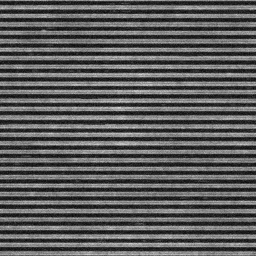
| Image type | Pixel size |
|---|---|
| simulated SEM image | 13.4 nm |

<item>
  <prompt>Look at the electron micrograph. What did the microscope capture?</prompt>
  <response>parallel lines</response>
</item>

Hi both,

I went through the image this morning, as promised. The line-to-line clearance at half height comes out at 67.1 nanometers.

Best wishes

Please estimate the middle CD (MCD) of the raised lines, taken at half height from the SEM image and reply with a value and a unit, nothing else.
40.2 nanometers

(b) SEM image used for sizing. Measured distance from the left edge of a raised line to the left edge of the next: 114 nanometres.